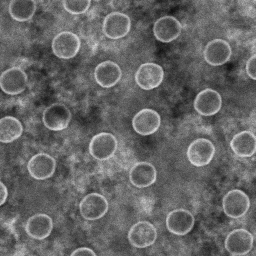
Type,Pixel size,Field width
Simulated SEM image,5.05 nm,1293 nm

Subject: a regular array of raised bodies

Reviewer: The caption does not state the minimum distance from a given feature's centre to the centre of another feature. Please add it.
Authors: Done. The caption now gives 49.3 pixels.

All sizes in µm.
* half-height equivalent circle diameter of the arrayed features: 0.132